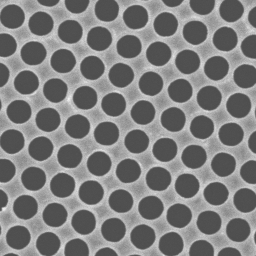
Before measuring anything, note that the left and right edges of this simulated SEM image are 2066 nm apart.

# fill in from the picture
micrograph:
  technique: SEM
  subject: a regular array of holes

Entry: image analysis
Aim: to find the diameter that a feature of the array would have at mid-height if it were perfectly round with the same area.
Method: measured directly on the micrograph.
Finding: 199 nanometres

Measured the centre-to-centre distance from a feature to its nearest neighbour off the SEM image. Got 240 nanometers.